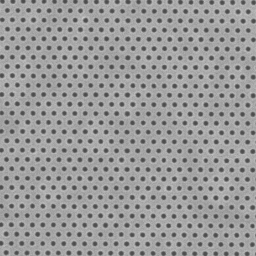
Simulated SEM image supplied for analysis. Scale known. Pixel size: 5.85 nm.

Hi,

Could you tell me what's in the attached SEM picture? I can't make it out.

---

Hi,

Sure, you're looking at a regular array of holes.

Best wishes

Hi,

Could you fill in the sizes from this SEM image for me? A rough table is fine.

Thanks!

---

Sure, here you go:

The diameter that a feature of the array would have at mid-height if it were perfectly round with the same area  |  28.8 nanometres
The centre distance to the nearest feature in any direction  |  58.7 nanometres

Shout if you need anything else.